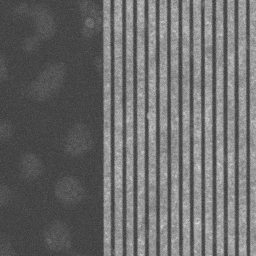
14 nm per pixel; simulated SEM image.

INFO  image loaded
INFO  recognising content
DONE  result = parallel lines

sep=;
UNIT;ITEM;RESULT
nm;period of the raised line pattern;158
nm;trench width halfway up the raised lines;61.3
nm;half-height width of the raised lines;94.5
